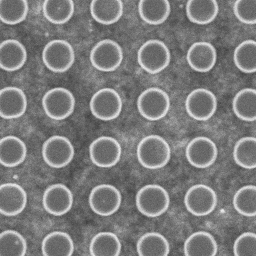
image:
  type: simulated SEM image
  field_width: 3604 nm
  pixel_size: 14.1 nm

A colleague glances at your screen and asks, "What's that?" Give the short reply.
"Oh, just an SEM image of a regular array of raised bodies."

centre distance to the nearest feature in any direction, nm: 668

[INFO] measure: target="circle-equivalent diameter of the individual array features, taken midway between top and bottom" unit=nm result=427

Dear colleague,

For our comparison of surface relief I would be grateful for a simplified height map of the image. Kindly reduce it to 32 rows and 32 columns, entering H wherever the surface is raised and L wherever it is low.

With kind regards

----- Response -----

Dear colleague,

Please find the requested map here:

HHHLLLHHHLLLHHHLLLHHHLLLHHHLLHHH
HHHLLLHHHLLLHHHLLLHHHLLHHHHLLHHH
HHHLLLHHLLLLHHLLLLHHLLLLHHLLLLHH
LLLLLLLLLLLLLLLLLLLLLLLLLLLLLLLL
LLLLLLLLLLLLLLLLLLLLLLLLLLLLLLLL
HHLLLLHHLLLLHHLLLLHHLLLLLHLLLLHH
HHHLLHHHHLLLHHHLLHHHHLLLHHHLLHHH
HHHLLHHHHLLHHHHLLHHHHLLLHHHLLHHH
HHLLLLHHLLLLHHLLLLHHLLLLHHLLLLHH
LLLLLLLLLLLLLLLLLLLLLLLLLLLLLLLL
LLLLLLLLLLLLLLLLLLLLLLLLLLLLLLLL
HHHLLLHHLLLLHHLLLLHHLLLLHHLLLLHH
HHHLLHHHHLLLHHHLLHHHHLLHHHHLLHHH
HHHLLLHHHLLHHHHLLHHHHLLHHHHLLHHH
HHLLLLHHLLLLHHLLLLHHLLLLHHLLLLHH
LLLLLLLLLLLLLLLLLLLLLLLLLLLLLLLL
LLLLLLLLLLLLLLLLLLLLLLLLLLLLLLLL
HHLLLLHHLLLLHHLLLLHHLLLLHHLLLLHH
HHHLLLHHHLLHHHHLLHHHHLLHHHHLLHHH
HHHLLLHHHLLHHHHLLHHHHLLHHHHLLHHH
LHLLLLHHLLLLHHLLLLHHLLLLHHLLLLHH
LLLLLLLLLLLLLLLLLLLLLLLLLLLLLLLL
LLLLLLLLLLLLLLLLLLLLLLLLLLLLLLLL
HHLLLLHHLLLLHHLLLLHHLLLLHHLLLLLH
HHHLLLHHHLLHHHHLLHHHHLLHHHHLLHHH
HHHLLLHHHLLHHHHLLHHHHLLHHHHLLHHH
HHLLLLHHLLLLHHLLLLHHLLLLHHLLLLHH
LLLLLLLLLLLLLLLLLLLLLLLLLLLLLLLL
LLLLLLLLLLLLLLLLLLLLLLLLLLLLLLLL
HHHLLLHHLLLLHHLLLLHHLLLLHHLLLLHH
HHHLLHHHHLLHHHHLLHHHHLLHHHHLLHHH
HHHLLHHHHLLHHHHLLHHHHLLHHHHLLHHH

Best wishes